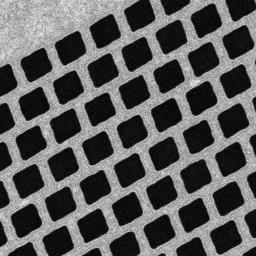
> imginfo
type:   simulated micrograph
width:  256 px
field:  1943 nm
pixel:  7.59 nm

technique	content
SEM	a regular array of holes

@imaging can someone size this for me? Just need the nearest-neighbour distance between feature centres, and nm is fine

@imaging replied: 290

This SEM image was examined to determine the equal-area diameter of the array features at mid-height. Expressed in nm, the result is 226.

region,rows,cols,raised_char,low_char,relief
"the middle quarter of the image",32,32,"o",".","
oooooo.......ooo....oooo.....ooo
oooooo.......ooo..ooooo......ooo
...ooo........oooooooo........oo
....ooo......oooo...ooo.......oo
....ooo....ooooo....ooo.......oo
.....ooo.ooooo.......oo.....oooo
.....ooooooooo.......ooo...oooo.
....oooooo.ooo........oooooooo..
...ooooo....oo.......oooooooooo.
.ooooo......ooo.....ooooo...ooo.
ooooo.......ooo...ooooo......oo.
o..oo........ooooooooo.......ooo
...ooo.......ooooooooo.......ooo
...ooo......ooooo..ooo........oo
....oo....ooooo.....ooo......ooo
....ooo.ooooo.......ooo....ooooo
....ooooooooo........oo...oooo..
...ooooo...ooo.......ooooooooo..
..oooo.....ooo......oooooo.ooo..
ooooo.......oo.....ooooo....oo..
ooooo.......ooo..ooooo......ooo.
..ooo.......ooooooooo.......ooo.
...oo.......ooooo.ooo........ooo
...ooo.....oooo....ooo.......ooo
...ooo...ooooo.....ooo......oooo
....ooooooooo.......oo....ooooo.
....oooooooo........ooo..oooo...
..oooooo..ooo.......ooooooooo...
oooooo.....oo.......oooo...oo...
oooo.......ooo....ooooo....ooo..
oooo........oo..ooooo.......oo..
..oo........ooooooooo.......ooo.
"